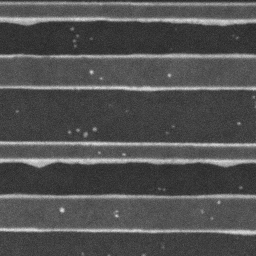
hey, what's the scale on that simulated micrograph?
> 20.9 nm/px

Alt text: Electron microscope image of lines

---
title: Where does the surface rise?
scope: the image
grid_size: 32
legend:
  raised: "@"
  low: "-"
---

@@@@@@@@@@@@@@@@@@@@-@-@--------
@@@@@@@@@@@@@@@@@@@@@@@@@@@@@@@@
--@@@----------------@@@@@@@@@@@
--------------------------------
--------------------------------
--------------------------------
--------------------------------
@@@@@@@@@@@@@@@@@@@@@@@@@@@@@@@@
@@@@@@@@@@@@@@@@@@@@@@@@@@@@@@@@
@@@@@@@@@@@@@@@@@@@@@@@@@@@@@@@@
@@@@@@@@@@@@@@@@@@@@@@@@@@@@@@@@
--------------------------------
--------------------------------
--------------------------------
--------------------------------
--------------------------------
--------------------------------
--------------------------------
@@@@@@@@@@@@@@@@@@@@@@@@@@@@@@@@
@@@@@@@@@@@@@@@@@@@@@@@@@@@@@@@@
--------------------------------
--------------------------------
--------------------------------
--------------------------------
--------------------------------
@@@@@@@@@@@@@@@@@@@@@@@@@@@@@@@@
@@@@@@@@@@@@@@@@@@@@@@@@@@@@@@@@
@@@@@@@@@@@@@@@@@@@@@@@@@@@@@@@@
@@@@@@@@@@@@@@@@@@@@@@@@@@@@@@@@
--------------------------------
--------------------------------
--------------------------------